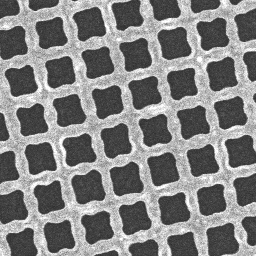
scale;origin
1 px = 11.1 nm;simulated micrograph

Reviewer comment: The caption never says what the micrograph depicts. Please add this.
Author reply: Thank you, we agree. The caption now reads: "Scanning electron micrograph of a regular array of holes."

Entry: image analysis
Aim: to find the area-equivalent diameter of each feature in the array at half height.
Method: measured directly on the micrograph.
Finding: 353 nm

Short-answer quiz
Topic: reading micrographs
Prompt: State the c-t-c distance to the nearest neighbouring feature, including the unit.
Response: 431 nm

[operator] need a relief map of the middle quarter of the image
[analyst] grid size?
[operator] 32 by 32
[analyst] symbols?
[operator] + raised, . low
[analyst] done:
..+++........++.......++++++++++
...+++.......++...+++++++++++...
...++.......++++++++++++++......
...+++..++++++++++++...+++......
...++++++++++++++.......++......
++++++++++++.+++.......+++......
+++++++.......++........++......
+++++++.......+++.......+++.....
....+++.......+++.......+++...++
....+++........++.......++++++++
....++++.......++....+++++++++++
.....+++.......+++.++++++++++...
.....+++.....+++++++++++.+++....
......+++.++++++++++++....++....
.....++++++++++++++.......+++...
.++++++++++++...+++.......+++...
++++++++++......+++.......+++...
+++++.+++.......++++.......++...
.......++.......++++.......+++..
.......+++.......+++......++++++
.......+++.......++++.++++++++++
.......+++.......++++++++++++++.
........++......+++++++++..++++.
........+++..++++++++.......+++.
........++++++++..+++.......+++.
+..++++++++++++....++.......++++
+++++++.++++.......++.......++++
+++++....++........+++.......+++
++........++.......+++.......+++
++........++........++......++++
++........++........+++.++++++++
++........++........++++++++++++